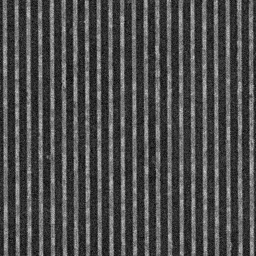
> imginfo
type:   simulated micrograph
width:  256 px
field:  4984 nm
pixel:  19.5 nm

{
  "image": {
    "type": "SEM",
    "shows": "parallel lines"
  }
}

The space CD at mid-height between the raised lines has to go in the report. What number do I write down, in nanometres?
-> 161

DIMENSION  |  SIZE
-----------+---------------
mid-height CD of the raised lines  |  70.6 nm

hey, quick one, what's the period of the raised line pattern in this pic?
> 228 nm